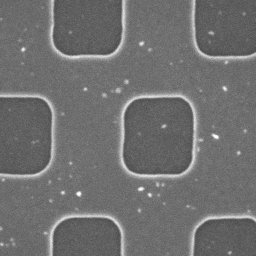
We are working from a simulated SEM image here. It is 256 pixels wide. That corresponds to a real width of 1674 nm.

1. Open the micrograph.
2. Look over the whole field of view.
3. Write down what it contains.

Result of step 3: holes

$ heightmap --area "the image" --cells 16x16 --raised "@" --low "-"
@@@-----@@@@----
@@@-----@@@@----
@@@-----@@@@----
@@@@@-@@@@@@@--@
@@@@@@@@@@@@@@@@
@@@@@@@@@@@@@@@@
---@@@@@----@@@@
---@@@@@----@@@@
---@@@@@----@@@@
---@@@@@----@@@@
---@@@@@----@@@@
@@@@@@@@@@@@@@@@
@@@@@@@@@@@@@@@@
@@@@@@@@@@@@@@@@
@@@-----@@@@----
@@@-----@@@@----